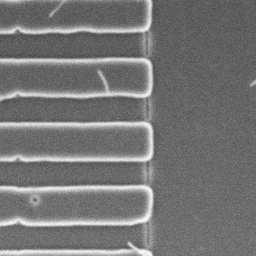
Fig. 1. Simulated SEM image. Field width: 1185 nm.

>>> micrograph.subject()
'wiring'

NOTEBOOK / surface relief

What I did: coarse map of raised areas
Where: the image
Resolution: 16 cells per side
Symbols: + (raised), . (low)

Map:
+++++++++.......
+++++++++.......
................
................
+++++++++.......
+++++++++.......
................
................
++++++++++......
++++++++++......
................
................
++++++++++......
+++++++++.......
................
................